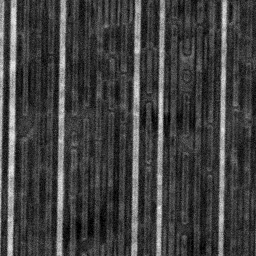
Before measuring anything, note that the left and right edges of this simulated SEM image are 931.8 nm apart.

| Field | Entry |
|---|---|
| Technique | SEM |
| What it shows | parallel lines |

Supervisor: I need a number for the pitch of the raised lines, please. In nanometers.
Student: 45.2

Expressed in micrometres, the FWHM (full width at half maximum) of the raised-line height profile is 0.0155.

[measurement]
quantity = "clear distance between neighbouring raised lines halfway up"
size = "30.5 nm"